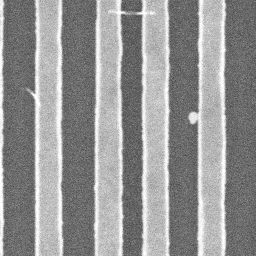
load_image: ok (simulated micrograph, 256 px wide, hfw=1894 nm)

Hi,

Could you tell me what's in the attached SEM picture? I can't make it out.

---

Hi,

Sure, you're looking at lines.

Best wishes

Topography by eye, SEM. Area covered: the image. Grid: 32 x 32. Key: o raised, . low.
.....ooo....ooo...ooo....ooo....
.....ooo....ooo...ooo....ooo....
.....ooo....ooo...ooo....ooo....
.....ooo....ooo...ooo....ooo....
.....ooo....ooo...ooo....ooo....
.....ooo....ooo...ooo....ooo....
.....ooo....ooo...ooo....ooo....
....oooo....ooo...ooo....ooo....
....oooo....ooo...ooo....ooo....
....oooo....ooo...ooo....ooo....
....oooo....ooo...ooo....ooo....
....oooo....ooo...ooo....ooo....
....oooo....ooo...ooo....ooo....
....oooo....ooo...ooo....ooo....
....oooo....ooo...ooo....ooo....
.....ooo....ooo...ooo....ooo....
.....ooo....ooo...ooo....ooo....
.....ooo....ooo...ooo....ooo....
....oooo....ooo...ooo....ooo....
....oooo....ooo...ooo....ooo....
....oooo....ooo...ooo....ooo....
....oooo....ooo...ooo....ooo....
....oooo....ooo...ooo....ooo....
.....ooo....ooo...ooo....ooo....
....oooo....ooo...ooo....ooo....
.....ooo....ooo...ooo....ooo....
....oooo....ooo...ooo....ooo....
....oooo....ooo...ooo....ooo....
....oooo....ooo...ooo....ooo....
.....ooo....ooo...ooo....ooo....
....oooo....ooo...ooo....ooo....
....oooo....ooo...ooo....ooo....